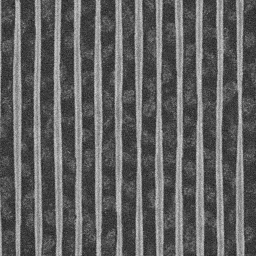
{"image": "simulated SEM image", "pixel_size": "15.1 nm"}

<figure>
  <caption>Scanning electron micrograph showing parallel lines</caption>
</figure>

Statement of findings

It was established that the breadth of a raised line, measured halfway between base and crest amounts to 63.9 nm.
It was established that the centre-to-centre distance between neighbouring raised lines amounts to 304 nm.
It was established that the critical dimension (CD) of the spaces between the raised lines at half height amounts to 231 nanometres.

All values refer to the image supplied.